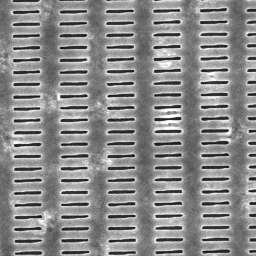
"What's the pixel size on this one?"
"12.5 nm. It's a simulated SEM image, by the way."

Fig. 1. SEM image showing a regular array of holes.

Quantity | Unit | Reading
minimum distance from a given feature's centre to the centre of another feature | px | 11.9